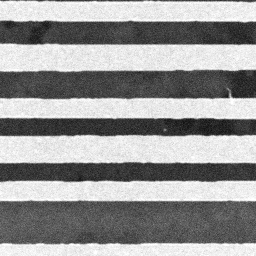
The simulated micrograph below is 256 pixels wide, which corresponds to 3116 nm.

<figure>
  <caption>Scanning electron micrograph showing lines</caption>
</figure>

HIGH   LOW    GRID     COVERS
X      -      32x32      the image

XXXXXXXXXXXXXXXXXXXXXXXXXXXXXXXX
XXXXXXXXXXXXXXXXXXXXXXXXXXXXXXXX
-XXXXXXXXXXXXXXXXXXXXXXXXXXXXXXX
--------------------------------
--------------------------------
--------------------------------
XXXXXXXXXXXXXXXXXXXXXXXXXXXXXXXX
XXXXXXXXXXXXXXXXXXXXXXXXXXXXXXXX
XXXXXXXXXXXXXXXXXXXXXXXXXXXXXXXX
--------------------------------
--------------------------------
--------------------------------
XXXXXXXXXXXXXXXXXXXXXXXXXXXXXXXX
XXXXXXXXXXXXXXXXXXXXXXXXXXXXXXXX
XXXXXXXXXXXXXXXXXXXXXXXXXXXXXXXX
--------------------------------
--------------------------------
XXXXXXXXXXXXXXXXXXXXXXXXXXXXXXXX
XXXXXXXXXXXXXXXXXXXXXXXXXXXXXXXX
XXXXXXXXXXXXXXXXXXXXXXXXXXXXXXXX
--------------------------------
--------------------------------
--------------------------------
XXXXXXXXXXXXXXXXXXXXXXXXXXXXXXXX
XXXXXXXXXXXXXXXXXXXXXXXXXXXXXXXX
--------------------------------
--------------------------------
--------------------------------
--------------------------------
--------------------------------
--------------------------------
XXXXXXXXXXXXXXXXXXXXXXXXXXXXXXXX